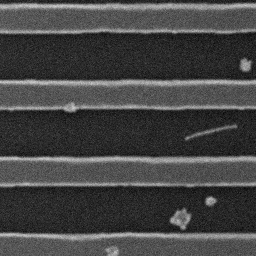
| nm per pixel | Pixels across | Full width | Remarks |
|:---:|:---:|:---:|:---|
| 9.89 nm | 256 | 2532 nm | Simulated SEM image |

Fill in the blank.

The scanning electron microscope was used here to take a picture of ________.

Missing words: lines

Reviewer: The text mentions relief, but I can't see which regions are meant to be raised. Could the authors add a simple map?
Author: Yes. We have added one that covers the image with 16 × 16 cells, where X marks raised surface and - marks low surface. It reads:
XXXXXXXXXXXXXXXX
XXXXXXXXXXXXXXXX
----------------
----------------
----------------
XXXXXXXXXXXXXXXX
XXXXXXXXXXXXXXXX
----------------
----------------
----------------
XXXXXXXXXXXXXXXX
XXXXXXXXXXXXXXXX
----------------
----------------
----------------
XXXXXXXXXXXXXXXX